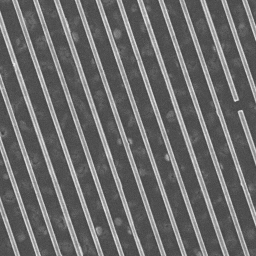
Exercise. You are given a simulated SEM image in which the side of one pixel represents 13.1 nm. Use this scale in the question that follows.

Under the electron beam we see parallel lines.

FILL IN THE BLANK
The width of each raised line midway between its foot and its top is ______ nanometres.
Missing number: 46.5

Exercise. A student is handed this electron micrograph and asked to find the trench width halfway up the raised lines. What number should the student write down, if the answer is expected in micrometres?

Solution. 0.211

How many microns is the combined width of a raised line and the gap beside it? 0.259